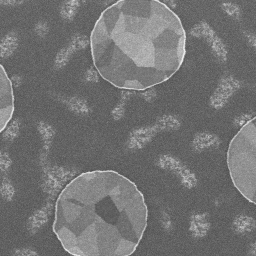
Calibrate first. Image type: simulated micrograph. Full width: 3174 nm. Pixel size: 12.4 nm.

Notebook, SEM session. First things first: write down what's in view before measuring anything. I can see raised bodies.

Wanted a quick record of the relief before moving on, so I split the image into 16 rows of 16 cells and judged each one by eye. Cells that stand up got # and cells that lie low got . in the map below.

.......###......
......#####.....
......######....
......#####.....
......#####.....
#.......#.......
#...............
#...............
...............#
..............##
..............##
....####.......#
....#####.......
...######.......
...######.......
....####........